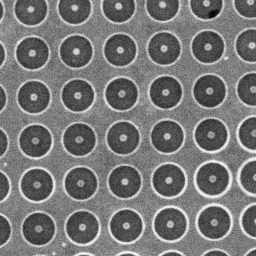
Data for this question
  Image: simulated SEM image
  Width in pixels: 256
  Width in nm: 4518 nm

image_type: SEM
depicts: an array of small figures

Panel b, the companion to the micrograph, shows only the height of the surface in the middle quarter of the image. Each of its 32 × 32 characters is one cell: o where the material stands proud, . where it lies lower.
o....oooooooo..ooooooooooooooooo
oooooooooooooooooooooooooooooooo
oooooooooooooooooooooooooooooooo
ooooooooooooo..oooooooo.....oooo
o.....ooooo......ooooo.......ooo
.......oooo.......oooo.......ooo
.......ooo.........oo.........oo
...o....oo....o....oo....o....oo
........oo........oooo.......ooo
.......oooo.......oooo.......ooo
.......oooo......oooooo.....oooo
o.....ooooooo...oooooooooooooooo
oooooooooooooooooooooooooooooooo
oooooooooooooooooooooooooooooooo
ooooooooooooo...oooooooo....oooo
o.....oooooo......ooooo......ooo
.......oooo.......oooo........oo
........ooo........ooo........oo
...oo...oo....o....ooo........oo
...o....ooo........ooo........oo
........ooo........ooo.......ooo
.......ooooo......ooooo.....oooo
oo....oooooooo..ooooooooo.oooooo
oooooooooooooooooooooooooooooooo
oooooooooooooooooooooooooooooooo
oooooooooooooo...ooooooo.....ooo
oo.....ooooo......ooooo.......oo
o.......oooo.......ooo........oo
........ooo........ooo.........o
....o....oo....o....oo.........o
........ooo........ooo........oo
........oooo.......oooo.......oo